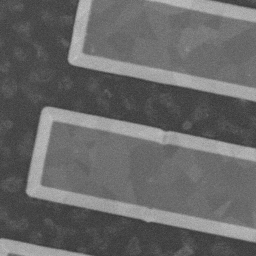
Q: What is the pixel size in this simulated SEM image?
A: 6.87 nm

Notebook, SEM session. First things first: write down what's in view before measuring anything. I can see one or a few lines or trenches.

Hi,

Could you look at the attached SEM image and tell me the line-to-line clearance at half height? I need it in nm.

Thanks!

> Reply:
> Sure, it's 408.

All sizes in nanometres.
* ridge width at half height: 538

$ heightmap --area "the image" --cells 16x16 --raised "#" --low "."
.....########...
.....###########
.....###########
.....###########
.........#######
..............##
................
...##...........
...#######......
...############.
..##############
..##############
.....###########
..........######
...............#
#...............